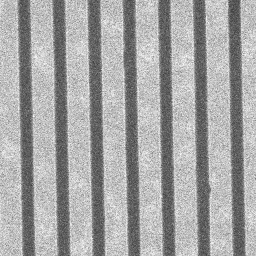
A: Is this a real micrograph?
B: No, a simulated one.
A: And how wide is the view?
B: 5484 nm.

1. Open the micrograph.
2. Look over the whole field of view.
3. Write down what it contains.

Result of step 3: parallel lines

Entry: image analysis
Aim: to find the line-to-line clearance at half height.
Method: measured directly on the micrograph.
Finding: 265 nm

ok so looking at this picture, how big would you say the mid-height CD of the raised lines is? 493 nanometers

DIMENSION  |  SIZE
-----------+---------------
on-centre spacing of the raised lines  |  751 nm